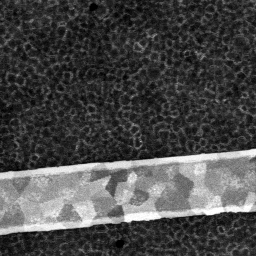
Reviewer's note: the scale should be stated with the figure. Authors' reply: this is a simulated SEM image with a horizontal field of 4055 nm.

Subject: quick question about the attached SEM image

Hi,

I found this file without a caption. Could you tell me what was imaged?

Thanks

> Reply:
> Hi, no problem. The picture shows one or a few lines or trenches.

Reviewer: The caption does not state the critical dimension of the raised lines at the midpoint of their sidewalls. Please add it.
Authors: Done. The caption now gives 866 nanometres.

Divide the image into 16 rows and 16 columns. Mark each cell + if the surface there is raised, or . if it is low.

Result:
................
................
................
................
................
................
................
................
................
................
.....+++++++++++
++++++++++++++++
++++++++++++++++
+++++++++.......
................
................